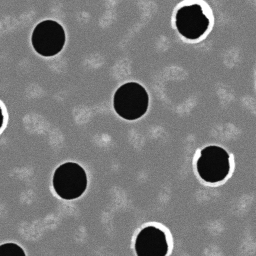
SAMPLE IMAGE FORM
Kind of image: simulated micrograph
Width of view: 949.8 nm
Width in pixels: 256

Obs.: holes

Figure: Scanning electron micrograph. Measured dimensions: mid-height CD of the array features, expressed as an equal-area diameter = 130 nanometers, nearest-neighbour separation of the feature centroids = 373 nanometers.